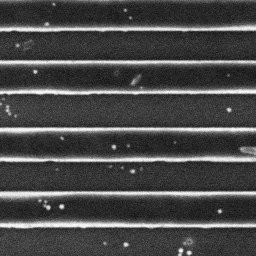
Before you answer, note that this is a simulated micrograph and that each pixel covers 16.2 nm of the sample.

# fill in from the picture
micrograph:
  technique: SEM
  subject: lines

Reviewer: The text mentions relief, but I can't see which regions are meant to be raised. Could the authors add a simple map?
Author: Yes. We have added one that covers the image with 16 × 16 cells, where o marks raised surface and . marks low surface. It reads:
oooooooooooooooo
oooooooooooooooo
................
................
oooooooooooooooo
oooooooooooooooo
................
................
oooooooooooooooo
oooooooooooooooo
................
................
oooooooooooooooo
oooooooooooooooo
................
................